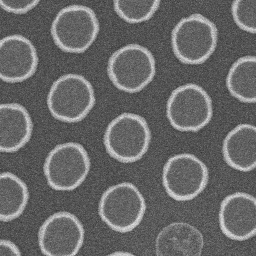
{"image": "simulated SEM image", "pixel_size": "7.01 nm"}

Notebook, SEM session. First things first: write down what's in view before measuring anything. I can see a regular array of raised bodies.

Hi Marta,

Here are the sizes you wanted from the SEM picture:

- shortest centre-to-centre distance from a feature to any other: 0.479 micrometres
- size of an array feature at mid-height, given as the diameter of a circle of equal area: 306 nm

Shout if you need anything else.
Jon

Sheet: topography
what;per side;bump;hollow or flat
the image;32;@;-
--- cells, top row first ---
@@@@-----------@@@@@---------@@@
--------@@@----@@@@----------@@@
-------@@@@@----@@-----@@-----@@
-------@@@@@----------@@@@@---@@
-------@@@@@----------@@@@@-----
@@@@---@@@@-----------@@@@@-----
@@@@-----------@@@----@@@@------
@@@@----------@@@@@----@@-----@@
@@@@----------@@@@@----------@@@
@@@-----------@@@@@----------@@@
-------@@@@----@@@----------@@@@
------@@@@@-----------@@@----@@@
------@@@@@@---------@@@@@-----@
@@@---@@@@@----------@@@@@------
@@@----@@@-----@-----@@@@@------
@@@@----------@@@@----@@@@------
@@@@---------@@@@@-----------@@@
@@@----------@@@@@----------@@@@
@@-----@@@----@@@@----------@@@@
------@@@@@---@@@-----@@----@@@@
------@@@@@----------@@@@----@@@
------@@@@@----------@@@@@------
@@----@@@@----------@@@@@@------
@@@----@@-----@@@----@@@@-------
@@@----------@@@@-----@@-----@@-
@@@----------@@@@@----------@@@@
@@@----------@@@@@----------@@@@
------@@@----@@@@-----------@@@@
-----@@@@@----@@------------@@@@
-----@@@@@-------------------@@-
@----@@@@@----------------------
@@----@@@-----------------------